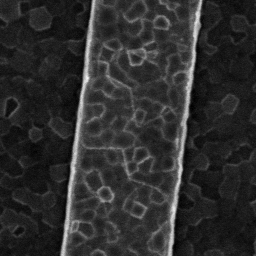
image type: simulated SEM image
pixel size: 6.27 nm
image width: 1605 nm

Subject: one or a few lines or trenches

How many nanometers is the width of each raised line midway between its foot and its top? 664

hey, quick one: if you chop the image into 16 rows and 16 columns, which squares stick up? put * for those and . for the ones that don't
......******....
......******....
......******....
.....*******....
.....*******....
.....*******....
.....*******....
.....*******....
.....******.....
.....******.....
.....******.....
....*******.....
....*******.....
....*******.....
....*******.....
....*******.....